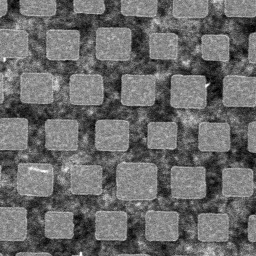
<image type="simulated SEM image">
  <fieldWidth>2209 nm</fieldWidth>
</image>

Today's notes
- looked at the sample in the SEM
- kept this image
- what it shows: a regular array of raised bodies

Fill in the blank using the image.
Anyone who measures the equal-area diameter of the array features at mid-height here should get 301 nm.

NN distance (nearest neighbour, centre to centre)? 0.434 µm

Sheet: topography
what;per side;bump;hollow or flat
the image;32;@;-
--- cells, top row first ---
@--@@@@--@@@@--@@@@@--@@@@--@@@@
@--@@@@---@@@--@@@@@--@@@@--@@@@
--------------------------------
--------------@@----------------
@@@---@@@@--@@@@---@@@----@@---@
@@@---@@@@--@@@@---@@@---@@@@--@
@@@---@@@@--@@@@---@@@---@@@@--@
---------------------------@---@
--------------------------------
---@@@---@@@----@@@---@---------
---@@@@--@@@@--@@@@--@@@@@--@@@@
---@@@@--@@@@--@@@@--@@@@@--@@@@
---@@@@--@@@@--@@@@--@@@@@--@@@@
------------------------@-------
--------------------------------
@@@---@@@@--@@@@---@@@---@@@---@
@@@---@@@@--@@@@---@@@---@@@@--@
@@@---@@@@--@@@@---@@@---@@@@--@
@@@---@@@---@@@@---@@@---@@@@--@
--------------------------------
---------------@@@@-------------
--@@@@@--@@@@--@@@@@-@@@@@--@@@-
--@@@@@--@@@@--@@@@@-@@@@@--@@@@
--@@@@@--@@@@--@@@@@-@@@@@--@@@@
---------------@@@@---@@@-------
--------------------------------
@@@---------@@@----@@-----------
@@@---@@@---@@@@--@@@@---@@@@--@
@@@---@@@---@@@@--@@@@---@@@@--@
@@@---@@@---@@@@--@@@@---@@@@--@
--------------------------------
--------------------------------